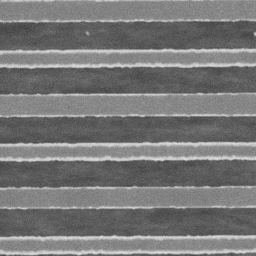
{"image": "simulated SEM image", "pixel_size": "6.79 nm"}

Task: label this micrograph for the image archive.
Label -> lines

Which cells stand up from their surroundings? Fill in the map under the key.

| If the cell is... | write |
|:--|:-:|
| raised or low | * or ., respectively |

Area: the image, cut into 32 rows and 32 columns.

********************************
********************************
******************************.*
................................
................................
................................
********************************
********************************
................................
................................
................................
................................
********************************
********************************
***********..*..............*...
................................
................................
................................
********************************
********************************
................................
................................
................................
.***...*************************
********************************
********************************
................................
................................
................................
..............*..*........******
********************************
*******************************.